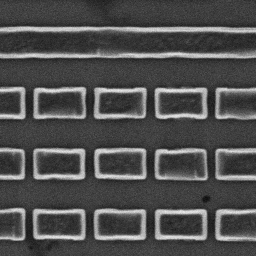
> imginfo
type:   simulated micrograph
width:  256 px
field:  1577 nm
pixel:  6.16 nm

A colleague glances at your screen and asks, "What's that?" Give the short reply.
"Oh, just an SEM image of wiring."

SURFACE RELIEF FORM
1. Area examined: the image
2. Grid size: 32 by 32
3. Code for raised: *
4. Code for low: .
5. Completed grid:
................................
................................
................................
................................
********************************
********************************
********************************
................................
................................
................................
................................
***..*****..******..*****..**..*
***..*****..******..*****..*****
***..*****..******..******.*****
.**..*......**......**..*.......
................................
................................
................................
................................
***..*****..******..*****..*****
***..*****..******..*****..*****
***..*****..******..*****..*****
................................
................................
................................
................................
***..*...*..***.........*...*...
***.******..******..******.*****
***..*****..******..******.*****
.**..*****..******..*****..****.
................................
................................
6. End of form